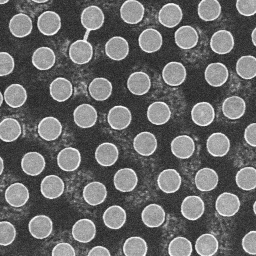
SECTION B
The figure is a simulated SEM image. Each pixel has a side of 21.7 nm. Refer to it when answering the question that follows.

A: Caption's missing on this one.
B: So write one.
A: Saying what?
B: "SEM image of a regular array of raised bodies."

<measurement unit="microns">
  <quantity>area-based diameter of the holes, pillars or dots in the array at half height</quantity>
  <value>0.499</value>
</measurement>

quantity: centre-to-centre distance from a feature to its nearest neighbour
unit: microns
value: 0.711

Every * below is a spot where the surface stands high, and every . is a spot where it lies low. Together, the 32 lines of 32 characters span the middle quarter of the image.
.........................*****..
.........................*****..
.................***.....*****..
................*****....*****..
*......****.....*****....*****..
**....******....*****...........
**....******.....****...........
**.....*****......**............
*......****.....................
................................
....***...............****......
...*****....****.....*****......
...*****...******....******.....
...*****...******....*****......
...*****...*****......***.......
....***.....****................
................................
...................***..........
..................*****.....****
.................******....*****
.........****.....*****....*****
***.....*****.....*****....*****
****....*****......***......****
****....*****...................
****.....****...................
***.............................
**............***..........*....
.............*****......****....
.............*****......*****...
.............*****......*****...
......****...*****......*****...
.....*****....***.......****....